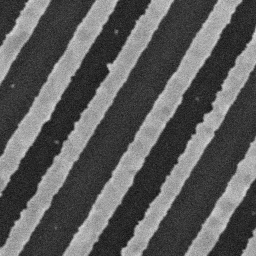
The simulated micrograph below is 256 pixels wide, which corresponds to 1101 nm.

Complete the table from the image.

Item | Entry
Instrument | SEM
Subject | lines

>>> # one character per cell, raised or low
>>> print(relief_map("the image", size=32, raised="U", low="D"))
DDDUUUDDDDDDUUDDDDDUUDDDDDDUUUDD
DDDUUUDDDDDUUUDDDDUUUDDDDDUUUDDD
DDUUUDDDDDUUUDDDDUUUDDDDDDUUUDDD
DDUUDDDDDDUUUDDDDUUUDDDDDUUUDDDD
DUUUDDDDDUUUDDDDUUUDDDDDDUUDDDDD
UUUDDDDDDUUDDDDDUUDDDDDDUUUDDDDU
UUDDDDDDUUUDDDDUUUDDDDDUUUDDDDUU
UUDDDDDUUUDDDDUUUDDDDDDUUUDDDDUU
UDDDDDDUUUDDDDUUUDDDDDUUUDDDDUUU
UDDDDDUUUDDDDUUUDDDDDDUUDDDDUUUD
DDDDDDUUUDDDDUUDDDDDDUUUDDDDUUUD
DDDDDUUUDDDDUUUDDDDDUUUDDDDUUUDD
DDDDUUUDDDDUUUDDDDDDUUUDDDDUUDDD
DDDDUUUDDDDUUDDDDDDUUUDDDDDUUDDD
DDDUUUDDDDUUUDDDDDUUUUDDDDUUDDDD
DDUUUUDDDUUUDDDDDDUUUDDDDUUUDDDD
DDUUUDDDDUUUDDDDDUUUDDDDDUUDDDDD
DUUUDDDDUUUDDDDDDUUUDDDDUUDDDDDD
DUUUDDDDUUDDDDDDUUUDDDDUUUDDDDDU
UUUDDDDUUUDDDDDUUUDDDDDUUDDDDDDU
UUDDDDDUUDDDDDDUUUDDDDUUUDDDDDUU
UUDDDDUUUDDDDDUUUDDDDUUUDDDDDUUU
UDDDDUUUDDDDDDUUUDDDDUUDDDDDDUUU
UDDDDUUUDDDDDUUUDDDDUUUDDDDDUUUD
DDDDUUUDDDDDUUUDDDDDUUDDDDDDUUUD
DDDUUUDDDDDDUUUDDDDUUDDDDDDUUUDD
DDDUUUDDDDDUUUDDDDUUUDDDDDUUUDDD
DDUUUDDDDDDUUUDDDDUUDDDDDDUUUDDD
DDUUDDDDDDUUUDDDDUUUDDDDDUUUDDDD
DUUUDDDDDUUUDDDDDUUDDDDDDUUDDDDD
DUUDDDDDDUUUDDDDUUDDDDDDUUUDDDDU
UUUDDDDDUUUDDDDUUUDDDDDUUUDDDDUU